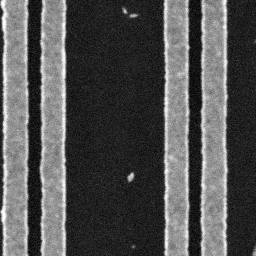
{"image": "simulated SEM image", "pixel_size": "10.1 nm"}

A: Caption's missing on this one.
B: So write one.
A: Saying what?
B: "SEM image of lines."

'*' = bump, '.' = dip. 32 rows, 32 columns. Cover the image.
***..***.............**..***....
***..***.............**..***....
***..***.............**..***....
***..***.............**..***....
.**..***.............**..***....
.**..***.............***.***....
.**..***.............**..***....
***..***.............**..***....
***..***.............**..***....
.**..***.............**..***....
.**..***.............**..***....
***..***.............**..***....
***..***.............**..***....
***..***.............***.***....
.***.***.............***.***....
***..***.............***.***....
***..***.............**..***....
***..***.............**..***....
***..***.............**..***....
***..***.............**..***....
.**..***.............**..***....
.**..***.............**..***....
***..***.............**..***....
.**..***.............**..***....
***..***.............**..***....
***..***.............***.***....
***..***.............***.***....
***..***.............**..***....
***..***.............**..***....
***..***.............**..***....
***..***.............**..***....
***..***.............**..***....